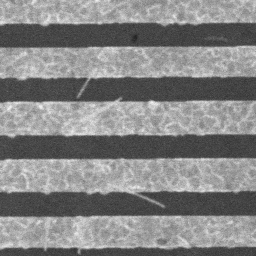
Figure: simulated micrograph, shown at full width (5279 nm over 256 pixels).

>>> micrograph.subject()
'lines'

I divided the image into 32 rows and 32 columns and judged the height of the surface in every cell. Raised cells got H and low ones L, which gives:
HHHHHHHHHHHHHHHHHHHHHHHHHHHHHHHH
HHHHHHHHHHHHHHHHHHHHHHHHHHHHHHHH
HHHHHHHHHHHHHHHHHHHHHHHHHHHHHHHH
LLLLLLLLLLLLLLLLLLLLLLLLLLLLLLLL
LLLLLLLLLLLLLLLLLLLLLLLLLLLLLLLL
LLLLLLLLLLLLLLLLLLLLLLLLLLLLLLLL
HHHHHHHHHHHHHHHHHHHHHHHHHHHHHHHH
HHHHHHHHHHHHHHHHHHHHHHHHHHHHHHHH
HHHHHHHHHHHHHHHHHHHHHHHHHHHHHHHH
HHHHHHHHHHHHHHHHHHLHHLLLHHLLLLLL
LLLLLLLLLLLLLLLLLLLLLLLLLLLLLLLL
LLLLLLLLLLLLLLLLLLLLLLLLLLLLLLLL
LLLLLLLLLLLLLLLLLLLLLLLLLLLLLLLL
HHHHHHHHHHHHHHHHHHHHHHHHHHHHHHHH
HHHHHHHHHHHHHHHHHHHHHHHHHHHHHHHH
HHHHHHHHHHHHHHHHHHHHHHHHHHHHHHHH
HHHHHHHHHHHHHHHHHHHHHHHHHHHHHHHH
LLLLLLLLLLLLLLLLLLLLLLLLLLLLLLLL
LLLLLLLLLLLLLLLLLLLLLLLLLLLLLLLL
LLLLLLLLLLLLLLLLLLLLLLLLLLLLLLLL
HHHHHHHHHHHHHHHHHHHHHHHHHHHHHHHH
HHHHHHHHHHHHHHHHHHHHHHHHHHHHHHHH
HHHHHHHHHHHHHHHHHHHHHHHHHHHHHHHH
HHHHHHHHHHHHHHHHHHHHHHHHHHHHHHHH
LLLLLLLLLLLLLLLLLLLLLLLLLLLLLLLL
LLLLLLLLLLLLLLLLLLLLLLLLLLLLLLLL
LLLLLLLLLLLLLLLLLLLLLLLLLLLLLLLL
HHHHHHHHHHHHHHHHHHHHHHHHHHHHHHHH
HHHHHHHHHHHHHHHHHHHHHHHHHHHHHHHH
HHHHHHHHHHHHHHHHHHHHHHHHHHHHHHHH
HHHHHHHHHHHHHHHHHHHHHHHHHHHHHHHH
LLLLLLLLLLLLLLLLLLLLLLLLLLLLLLLL